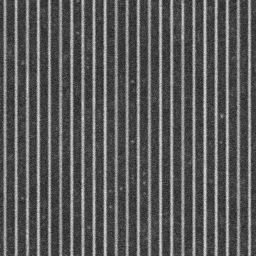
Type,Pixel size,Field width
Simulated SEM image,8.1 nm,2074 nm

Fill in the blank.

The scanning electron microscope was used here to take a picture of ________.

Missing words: parallel lines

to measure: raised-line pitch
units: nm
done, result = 89.9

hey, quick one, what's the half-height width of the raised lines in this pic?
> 14.2 nanometres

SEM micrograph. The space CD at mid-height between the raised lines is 9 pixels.